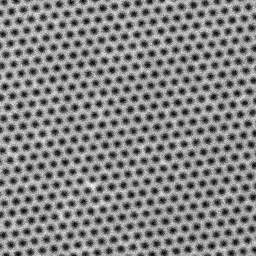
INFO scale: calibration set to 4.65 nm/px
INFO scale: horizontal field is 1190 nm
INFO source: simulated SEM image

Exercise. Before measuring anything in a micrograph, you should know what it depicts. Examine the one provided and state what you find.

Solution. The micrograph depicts a regular array of holes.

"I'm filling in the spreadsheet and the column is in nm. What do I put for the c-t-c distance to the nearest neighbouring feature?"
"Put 55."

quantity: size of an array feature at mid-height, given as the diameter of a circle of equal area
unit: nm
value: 35.6